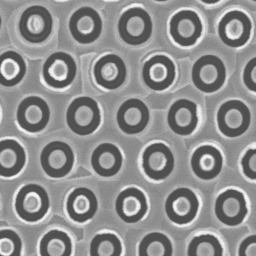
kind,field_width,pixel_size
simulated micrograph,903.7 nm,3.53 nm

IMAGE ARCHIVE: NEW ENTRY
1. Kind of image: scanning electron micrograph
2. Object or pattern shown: a regular array of ring-shaped grooves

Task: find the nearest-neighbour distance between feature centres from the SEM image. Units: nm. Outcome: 175